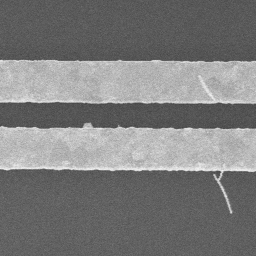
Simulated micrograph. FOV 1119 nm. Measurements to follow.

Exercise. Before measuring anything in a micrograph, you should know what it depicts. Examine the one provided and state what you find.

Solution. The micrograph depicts lines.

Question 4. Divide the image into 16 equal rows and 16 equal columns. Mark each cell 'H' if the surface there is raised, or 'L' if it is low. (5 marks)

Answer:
LLLLLLLLLLLLLLLL
LLLLLLLLLLLLLLLL
LLLLLLLLLLLLLLLL
LLLLLLLLLLLLLLLL
HHHHHHHHHHHHHHHH
HHHHHHHHHHHHHHHH
LLLLLLLLLLLLLLLL
LLLLLLLLLLLLLLLL
HHHHHHHHHHHHHHHH
HHHHHHHHHHHHHHHH
HHHHHHHHHHHHHHHH
LLLLLLLLLLLLLLLL
LLLLLLLLLLLLLLLL
LLLLLLLLLLLLLLLL
LLLLLLLLLLLLLLLL
LLLLLLLLLLLLLLLL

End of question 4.